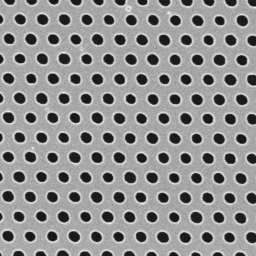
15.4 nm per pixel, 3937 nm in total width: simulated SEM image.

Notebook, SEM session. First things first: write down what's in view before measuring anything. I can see a regular array of holes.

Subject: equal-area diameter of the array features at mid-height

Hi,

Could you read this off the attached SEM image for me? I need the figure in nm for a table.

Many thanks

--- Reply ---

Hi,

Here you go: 170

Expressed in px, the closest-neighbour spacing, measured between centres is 22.